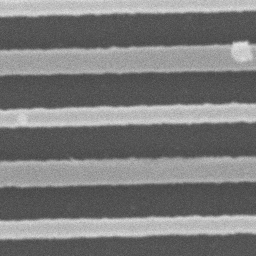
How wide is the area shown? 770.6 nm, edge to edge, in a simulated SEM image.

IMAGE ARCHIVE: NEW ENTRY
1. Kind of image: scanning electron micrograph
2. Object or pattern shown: lines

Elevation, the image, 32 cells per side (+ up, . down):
++++++++++++++++++++++++++++++++
++++++++++++++++++++++++.+......
................................
................................
................................
.............................++.
++++++++++++++++++++++++++++++++
++++++++++++++++++++++++++++++++
++++++++++++++++++++++++++++++++
................................
................................
................................
................................
........++++++++++++++++++++++++
++++++++++++++++++++++++++++++++
++++++++++++++++................
................................
................................
................................
................................
++++++++++++++++++++++++++++++++
++++++++++++++++++++++++++++++++
++++++++++++++++++++++++++++++++
................................
................................
................................
................................
....++++++++++++++++++++++++++++
++++++++++++++++++++++++++++++++
++++++++++++++..................
................................
................................